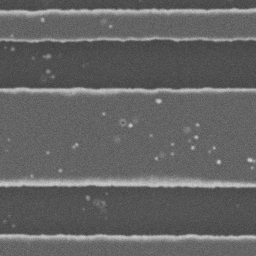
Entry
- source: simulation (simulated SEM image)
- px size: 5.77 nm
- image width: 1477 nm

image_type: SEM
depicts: lines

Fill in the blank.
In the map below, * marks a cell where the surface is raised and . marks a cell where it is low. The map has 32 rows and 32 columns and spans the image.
................................
********************************
********************************
********************************
********************************
................................
................................
................................
................................
................................
................................
********************************
********************************
********************************
********************************
********************************
********************************
********************************
********************************
********************************
********************************
********************************
********************************
................................
................................
................................
................................
................................
................................
********************************
********************************
********************************